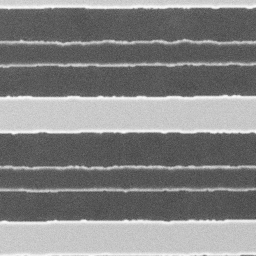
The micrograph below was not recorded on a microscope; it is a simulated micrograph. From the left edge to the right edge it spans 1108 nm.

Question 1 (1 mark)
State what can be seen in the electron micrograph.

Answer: lines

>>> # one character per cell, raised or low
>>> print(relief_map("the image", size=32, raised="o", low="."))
oooooooooooooooooooooooooooooooo
................................
................................
................................
................................
oooooooooooooooooooooooooooooooo
oooooooooooooooooooooooooooooooo
oooooooooooooooooooooooooooooooo
................................
................................
................................
................................
oooooooooooooooooooooooooooooooo
oooooooooooooooooooooooooooooooo
oooooooooooooooooooooooooooooooo
oooooooooooooooooooooooooooooooo
oooooooooo..o.oo....o.ooo.oooooo
................................
................................
................................
................................
oooooooooooooooooooooooooooooooo
oooooooooooooooooooooooooooooooo
oooooooooooooooooooooooooooooooo
................................
................................
................................
................................
oooooooooooooooooooooooooooooooo
oooooooooooooooooooooooooooooooo
oooooooooooooooooooooooooooooooo
oooooooooooooooooooooooooooooooo